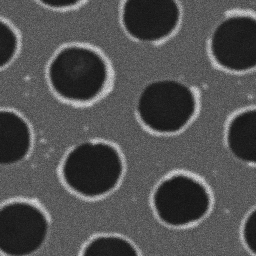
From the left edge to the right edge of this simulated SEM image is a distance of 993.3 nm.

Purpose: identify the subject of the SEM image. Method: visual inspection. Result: holes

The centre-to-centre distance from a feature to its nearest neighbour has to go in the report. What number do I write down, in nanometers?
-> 365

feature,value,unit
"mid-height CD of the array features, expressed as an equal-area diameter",0.21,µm